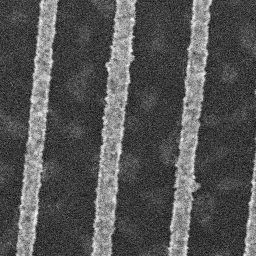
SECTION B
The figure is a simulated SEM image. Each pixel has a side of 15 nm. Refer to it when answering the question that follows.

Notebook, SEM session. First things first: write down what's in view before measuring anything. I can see one or a few lines or trenches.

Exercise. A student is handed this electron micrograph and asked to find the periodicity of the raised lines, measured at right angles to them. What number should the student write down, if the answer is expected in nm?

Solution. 1150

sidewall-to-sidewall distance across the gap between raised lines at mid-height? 885 nanometers